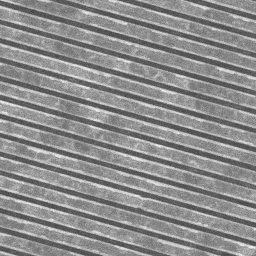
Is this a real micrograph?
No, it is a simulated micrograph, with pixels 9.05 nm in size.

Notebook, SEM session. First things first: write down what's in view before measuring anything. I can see parallel lines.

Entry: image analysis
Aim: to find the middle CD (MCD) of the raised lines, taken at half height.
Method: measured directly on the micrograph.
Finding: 113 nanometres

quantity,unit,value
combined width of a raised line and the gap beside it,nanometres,164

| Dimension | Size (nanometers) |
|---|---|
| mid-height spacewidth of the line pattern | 52.3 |